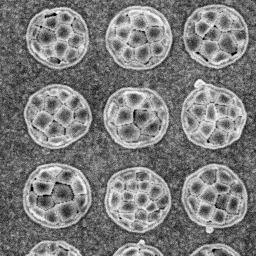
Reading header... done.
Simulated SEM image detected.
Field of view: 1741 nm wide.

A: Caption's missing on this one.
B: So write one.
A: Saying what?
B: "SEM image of a regular array of raised bodies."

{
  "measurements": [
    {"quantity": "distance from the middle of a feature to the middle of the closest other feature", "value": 528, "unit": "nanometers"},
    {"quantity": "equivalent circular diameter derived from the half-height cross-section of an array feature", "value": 399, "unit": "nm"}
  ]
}